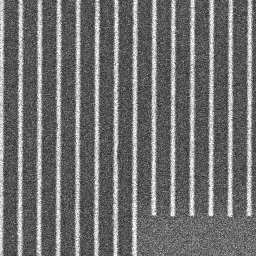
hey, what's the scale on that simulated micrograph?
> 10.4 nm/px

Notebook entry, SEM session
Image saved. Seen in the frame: parallel lines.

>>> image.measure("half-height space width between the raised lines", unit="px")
15.7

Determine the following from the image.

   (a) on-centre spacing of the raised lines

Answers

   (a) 0.198 micrometres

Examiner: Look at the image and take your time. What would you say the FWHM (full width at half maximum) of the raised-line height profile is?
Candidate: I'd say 38.9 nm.